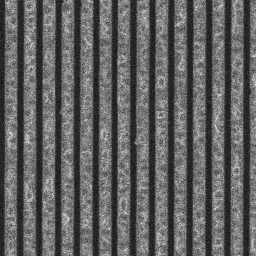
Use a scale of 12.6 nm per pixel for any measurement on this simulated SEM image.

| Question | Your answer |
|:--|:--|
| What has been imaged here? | parallel lines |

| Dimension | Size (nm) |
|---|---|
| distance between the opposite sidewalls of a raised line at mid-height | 154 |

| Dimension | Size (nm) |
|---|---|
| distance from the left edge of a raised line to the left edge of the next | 237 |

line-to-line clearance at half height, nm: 88.1